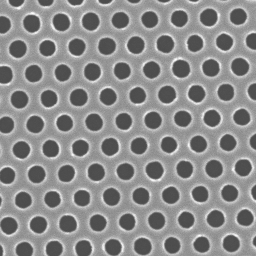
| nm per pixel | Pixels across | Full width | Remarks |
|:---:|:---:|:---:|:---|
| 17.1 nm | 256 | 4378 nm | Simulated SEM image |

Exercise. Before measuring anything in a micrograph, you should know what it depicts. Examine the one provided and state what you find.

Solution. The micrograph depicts a regular array of holes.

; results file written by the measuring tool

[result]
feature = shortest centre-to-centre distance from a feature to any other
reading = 496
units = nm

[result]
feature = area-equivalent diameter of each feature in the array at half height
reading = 296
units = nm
